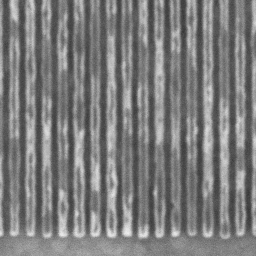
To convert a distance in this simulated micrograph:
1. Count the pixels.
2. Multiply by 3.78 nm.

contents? parallel lines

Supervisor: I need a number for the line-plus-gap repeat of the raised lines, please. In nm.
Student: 61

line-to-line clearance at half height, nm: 31.7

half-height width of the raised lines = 31.7 nm